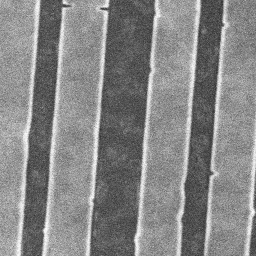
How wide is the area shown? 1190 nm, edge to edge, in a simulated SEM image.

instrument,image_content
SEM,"one or a few lines or trenches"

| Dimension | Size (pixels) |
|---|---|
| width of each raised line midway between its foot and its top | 43.5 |